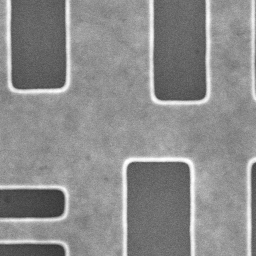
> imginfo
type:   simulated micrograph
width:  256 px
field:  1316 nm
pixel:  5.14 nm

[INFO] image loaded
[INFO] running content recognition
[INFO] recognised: groups of lines, slits or small figures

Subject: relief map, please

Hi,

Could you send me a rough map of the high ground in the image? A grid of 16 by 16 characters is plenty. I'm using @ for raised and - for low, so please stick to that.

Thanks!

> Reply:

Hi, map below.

@---@@@@@----@@@
@---@@@@@----@@@
@---@@@@@----@@@
@---@@@@@----@@@
@---@@@@@----@@@
@---@@@@@@---@@@
@@@@@@@@@@@@@@@@
@@@@@@@@@@@@@@@@
@@@@@@@@@@@@@@@@
@@@@@@@@@@@@@@@@
@@@@@@@@----@@@@
@@@@@@@@----@@@@
----@@@@----@@@@
----@@@@----@@@@
@@@@@@@@----@@@@
----@@@@----@@@@